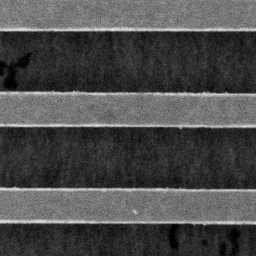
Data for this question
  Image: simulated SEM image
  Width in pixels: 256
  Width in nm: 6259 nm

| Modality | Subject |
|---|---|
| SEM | lines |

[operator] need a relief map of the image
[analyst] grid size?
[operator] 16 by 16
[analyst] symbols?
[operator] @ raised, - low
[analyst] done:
@@@@@@@@@@@@@@@@
@@@@@@@@@@@@@@@@
----------------
----------------
----------------
----------------
@@@@@@@@@@@@@@@@
@@@@@@@@@@@@@@@@
----------------
----------------
----------------
----------------
@@@@@@@@@@@@@@@@
@@@@@@@@@@@@@@@@
----------------
----------------